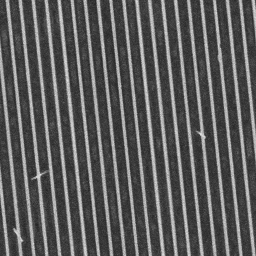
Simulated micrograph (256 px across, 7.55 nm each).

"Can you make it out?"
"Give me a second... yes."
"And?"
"parallel lines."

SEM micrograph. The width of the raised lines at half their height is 20.7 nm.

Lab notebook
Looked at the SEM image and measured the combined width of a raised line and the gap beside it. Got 97.3 nm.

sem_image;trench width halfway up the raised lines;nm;76